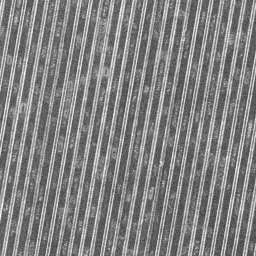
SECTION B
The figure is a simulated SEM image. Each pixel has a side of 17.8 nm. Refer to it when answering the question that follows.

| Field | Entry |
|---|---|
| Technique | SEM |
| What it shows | parallel lines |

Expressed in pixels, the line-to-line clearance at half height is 8.26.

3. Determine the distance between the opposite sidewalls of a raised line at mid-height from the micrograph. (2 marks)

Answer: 48.2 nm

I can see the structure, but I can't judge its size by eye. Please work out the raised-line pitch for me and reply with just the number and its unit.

192 nm